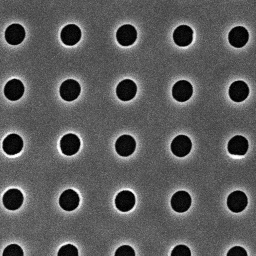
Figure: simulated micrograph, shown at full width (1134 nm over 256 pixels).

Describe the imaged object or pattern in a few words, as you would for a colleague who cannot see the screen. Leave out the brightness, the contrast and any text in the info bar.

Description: a regular array of holes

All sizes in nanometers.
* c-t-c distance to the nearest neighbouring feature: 243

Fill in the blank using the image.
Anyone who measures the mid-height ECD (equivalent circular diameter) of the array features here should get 94.8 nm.